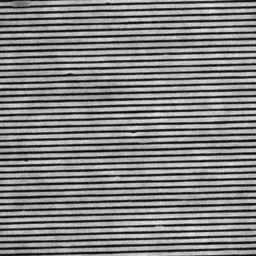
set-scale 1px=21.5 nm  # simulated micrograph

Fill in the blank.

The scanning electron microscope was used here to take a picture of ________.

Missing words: parallel lines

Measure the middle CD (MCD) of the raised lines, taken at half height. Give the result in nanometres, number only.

77.9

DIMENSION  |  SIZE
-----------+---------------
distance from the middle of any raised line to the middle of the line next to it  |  137 nm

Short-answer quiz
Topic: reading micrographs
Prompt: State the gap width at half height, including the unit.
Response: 0.0591 microns